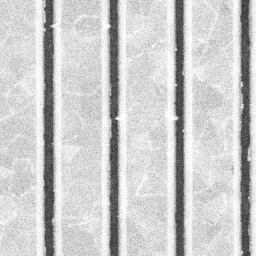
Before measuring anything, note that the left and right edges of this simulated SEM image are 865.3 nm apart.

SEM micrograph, one or a few lines or trenches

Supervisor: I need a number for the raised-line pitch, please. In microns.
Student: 0.221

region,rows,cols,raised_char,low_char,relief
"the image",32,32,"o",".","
ooooo..oooooo..oooooo...oooooo..
ooooo..oooooo..oooooo...oooooo..
ooooo..oooooo..oooooo...oooooo..
ooooo..oooooo..oooooo...oooooo..
ooooo..oooooo..oooooo...oooooo..
ooooo..oooooo..oooooo...oooooo..
ooooo..oooooo..oooooo...oooooo..
ooooo..oooooo..oooooo...oooooo..
ooooo..oooooo..oooooo...oooooo..
ooooo..oooooo..oooooo...oooooo..
ooooo..oooooo..oooooo...oooooo..
ooooo..oooooo..oooooo...oooooo..
ooooo..oooooo..oooooo...oooooo..
ooooo..oooooo..oooooo...oooooo..
ooooo..oooooo..oooooo...oooooo..
ooooo..oooooo..oooooo...oooooo..
ooooo..oooooo..oooooo...oooooo..
ooooo..oooooo..oooooo...oooooo..
ooooo..oooooo..oooooo...oooooo..
ooooo..oooooo..oooooo...oooooo..
ooooo..oooooo..oooooo...oooooo..
ooooo..oooooo..oooooo...oooooo..
ooooo..oooooo..oooooo...oooooo..
ooooo..oooooo..oooooo...oooooo..
ooooo..oooooo..oooooo...oooooo..
ooooo..oooooo..oooooo...oooooo..
ooooo..oooooo..oooooo...oooooo..
ooooo..oooooo..oooooo...oooooo..
ooooo..oooooo..oooooo...oooooo..
ooooo..oooooo..oooooo...oooooo..
ooooo..oooooo..oooooo...oooooo..
ooooo..oooooo..oooooo...oooooo..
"